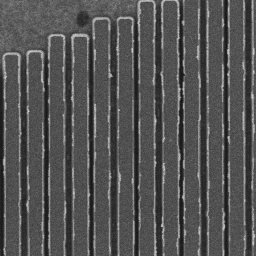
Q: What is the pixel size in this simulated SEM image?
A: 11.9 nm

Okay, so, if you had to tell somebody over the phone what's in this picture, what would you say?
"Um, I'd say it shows parallel lines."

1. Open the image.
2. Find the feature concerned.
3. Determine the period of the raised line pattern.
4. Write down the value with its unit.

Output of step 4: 267 nanometers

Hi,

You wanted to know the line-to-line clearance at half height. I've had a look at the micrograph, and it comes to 0.0713 µm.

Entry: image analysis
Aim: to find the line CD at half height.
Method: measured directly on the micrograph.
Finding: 202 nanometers